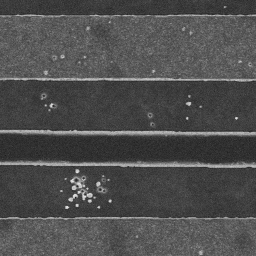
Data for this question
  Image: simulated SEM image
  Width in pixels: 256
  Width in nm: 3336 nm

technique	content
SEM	lines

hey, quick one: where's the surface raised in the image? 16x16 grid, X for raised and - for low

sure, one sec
----------------
XXXXXXXXXXXXXXXX
XXXXXXXXXXXXXXXX
XXXXXXXXXXXXXXXX
XXXXXXXXXXXXXXXX
----------------
----------------
----------------
XXXXXXXXXXXXXXXX
XXXXXXXXXXXXXXXX
----------------
----------------
----------------
----------------
XXXXXXXXXXXXXXXX
XXXXXXXXXXXXXXXX